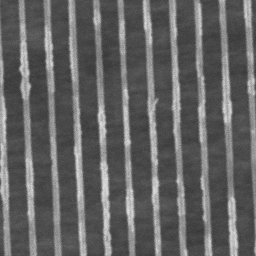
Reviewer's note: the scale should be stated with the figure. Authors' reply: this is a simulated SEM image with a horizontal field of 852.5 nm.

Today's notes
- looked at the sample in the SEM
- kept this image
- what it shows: parallel lines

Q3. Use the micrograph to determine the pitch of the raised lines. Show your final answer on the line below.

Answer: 25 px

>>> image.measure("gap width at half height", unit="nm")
66.1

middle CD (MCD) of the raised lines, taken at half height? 17.5 nm